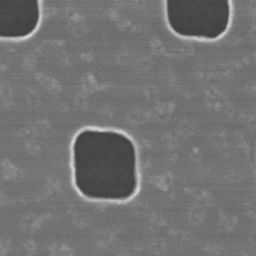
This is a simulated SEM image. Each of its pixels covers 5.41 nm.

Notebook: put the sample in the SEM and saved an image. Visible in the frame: holes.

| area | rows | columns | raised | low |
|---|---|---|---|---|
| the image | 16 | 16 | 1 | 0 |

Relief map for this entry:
0011111111000011
0011111111100011
1111111111111111
1111111111111111
1111111111111111
1111111111111111
1111111111111111
1111111111111111
1111100011111111
1111100011111111
1111100011111111
1111100011111111
1111111111111111
1111111111111111
1111111111111111
1111111111111111